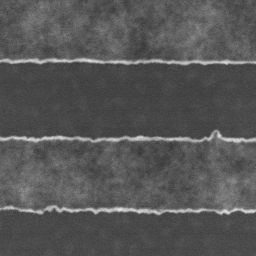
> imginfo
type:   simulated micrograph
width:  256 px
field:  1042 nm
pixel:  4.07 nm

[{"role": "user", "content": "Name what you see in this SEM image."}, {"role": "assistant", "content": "one or a few lines or trenches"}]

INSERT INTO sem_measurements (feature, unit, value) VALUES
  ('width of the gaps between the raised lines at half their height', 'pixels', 76.2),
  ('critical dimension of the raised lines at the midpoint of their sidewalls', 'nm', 295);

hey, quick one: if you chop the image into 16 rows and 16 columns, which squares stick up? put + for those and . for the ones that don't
++++++++++++++++
++++++++++++++++
++++++++++++++++
++++++++++++++++
................
................
................
................
.............+..
++++++++++++++++
++++++++++++++++
++++++++++++++++
++++++++++++++++
................
................
................